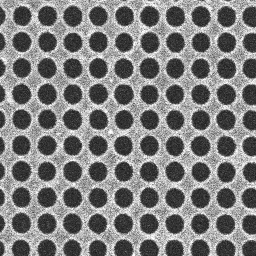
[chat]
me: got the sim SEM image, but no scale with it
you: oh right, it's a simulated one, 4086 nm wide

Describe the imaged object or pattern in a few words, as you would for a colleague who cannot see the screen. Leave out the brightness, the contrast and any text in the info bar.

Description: a regular array of holes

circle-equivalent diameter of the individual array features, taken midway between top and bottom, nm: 328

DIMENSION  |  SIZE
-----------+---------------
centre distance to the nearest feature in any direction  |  406 nm